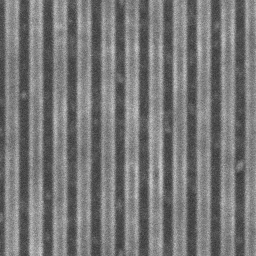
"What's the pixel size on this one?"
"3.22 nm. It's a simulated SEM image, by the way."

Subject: parallel lines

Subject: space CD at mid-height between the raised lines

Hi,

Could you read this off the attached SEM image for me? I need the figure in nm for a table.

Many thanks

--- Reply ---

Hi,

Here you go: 37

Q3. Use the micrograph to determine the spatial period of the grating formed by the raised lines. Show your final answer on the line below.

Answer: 77.3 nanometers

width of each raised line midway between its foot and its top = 39.8 nm